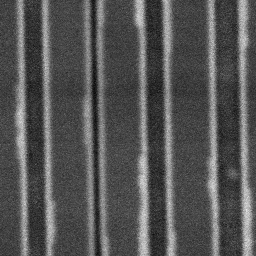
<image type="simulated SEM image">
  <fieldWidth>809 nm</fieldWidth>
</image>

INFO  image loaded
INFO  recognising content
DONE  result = one or a few lines or trenches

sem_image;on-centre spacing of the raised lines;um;0.193